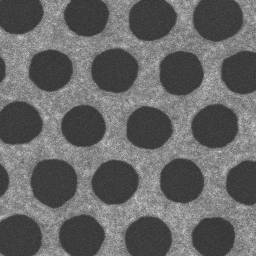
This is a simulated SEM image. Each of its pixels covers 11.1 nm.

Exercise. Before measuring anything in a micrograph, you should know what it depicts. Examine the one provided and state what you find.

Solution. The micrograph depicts a regular array of holes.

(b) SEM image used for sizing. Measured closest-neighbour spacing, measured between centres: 702 nm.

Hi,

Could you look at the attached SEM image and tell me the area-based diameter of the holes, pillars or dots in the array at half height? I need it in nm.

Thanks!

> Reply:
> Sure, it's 505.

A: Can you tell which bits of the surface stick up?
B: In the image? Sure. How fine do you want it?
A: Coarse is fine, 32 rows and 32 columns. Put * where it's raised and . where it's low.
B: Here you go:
.....****....****....****.....**
.....***......**......**......**
.....***......**......**......**
....*****....***......**......**
**********..*****....****....***
********************************
*****...*****...******.*******..
****.....***.....***.....***....
.***.....**......***.....***....
.***.....**......***.....***....
****....****.....***.....***....
**************..*****...*****...
********************************
....*****...*****...*****...****
.....***.....***.....***......**
.....***.....***......**......**
.....***.....***......**......**
....****.....***.....****....***
******************..******..****
********************************
*****....****...*****...******..
.***.....***.....***.....****...
.***......*......***.....***....
.***......*......***.....***....
****.....***.....****....****...
*****...*****..***************..
********************************
....****....*****...*****...****
.....***.....***.....***.....***
.....**......***.....***.....***
.....***.....***.....***.....***
.....***....****.....****....***